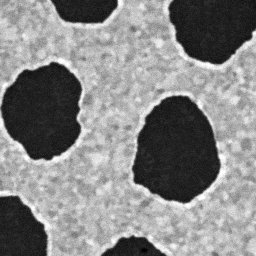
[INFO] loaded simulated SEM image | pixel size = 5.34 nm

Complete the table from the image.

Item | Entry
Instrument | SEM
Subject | holes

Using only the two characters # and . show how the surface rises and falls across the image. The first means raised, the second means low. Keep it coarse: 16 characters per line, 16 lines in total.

###....####.....
#####.#####.....
###########.....
############...#
#....###########
.....###########
.....#####..####
.....####....###
#....####....###
##..####......##
########......##
#########....###
.#########..####
..##############
...#############
...####...######